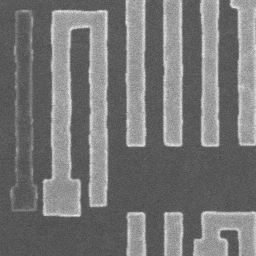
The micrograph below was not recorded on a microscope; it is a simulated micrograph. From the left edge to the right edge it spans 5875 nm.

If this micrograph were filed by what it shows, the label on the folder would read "wiring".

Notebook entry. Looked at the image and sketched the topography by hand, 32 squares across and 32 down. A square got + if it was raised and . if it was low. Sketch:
................++...+...++..+++
.......+++..+...++...+...++...++
..++...++++++...++...+...++...++
..++...++..++...++...+...++...++
..++...++..++...++...+...++...++
..++...++..++...++...++...+...++
..++...++..++...++...++...+...++
..++...++..++...++...++..++...++
..++...++..++...++...++..++...++
..++...++..++...++...++..++...++
..++...++..++...++...++..++...++
..++...++..++...++...++..++...++
..++...++..++...++...++..++...++
..++...++..++...++...++..++...++
..++...++..++...++...++..++...++
..++...++..++...++...++..++...++
..++...++..++...++...++..++...++
..++...++..++...++...++..++...++
..++...++..++...................
..++...++..++...................
..++...++..++...................
..++...++..++...................
..++..+++..++...................
..++..++++.++...................
..++..++++.++...................
..++..++++.++...................
......++++......................
................++...++..+++++++
................++...++..+++++++
................++...++..++...++
................++...++.++++..++
................++...++.++++..++